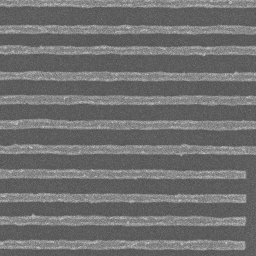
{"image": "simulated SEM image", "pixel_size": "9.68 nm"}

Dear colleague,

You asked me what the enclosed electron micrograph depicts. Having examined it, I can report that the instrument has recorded parallel lines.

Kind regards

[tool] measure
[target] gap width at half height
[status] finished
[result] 0.154 microns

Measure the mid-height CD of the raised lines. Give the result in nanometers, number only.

82.3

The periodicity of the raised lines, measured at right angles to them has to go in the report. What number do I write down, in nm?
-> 232